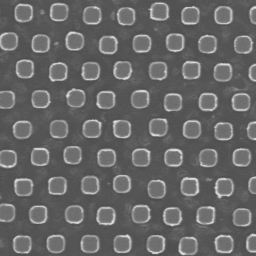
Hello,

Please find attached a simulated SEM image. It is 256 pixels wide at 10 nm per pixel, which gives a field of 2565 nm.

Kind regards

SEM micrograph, a regular array of raised bodies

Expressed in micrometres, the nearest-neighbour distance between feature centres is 0.316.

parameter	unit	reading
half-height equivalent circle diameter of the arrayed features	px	18.9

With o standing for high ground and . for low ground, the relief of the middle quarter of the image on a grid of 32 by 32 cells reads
o....oooo...ooooo.....ooo.....oo
o....oooo...ooooo.....oooo....oo
o...ooooo...ooooo.....oooo....oo
o....ooo.....ooo......ooo.....oo
................................
................................
..o.............................
.oooo....ooo.....oooo.....ooo...
.oooo...ooooo....oooo....oooo...
.oooo...ooooo....oooo....oooo...
..oo....oooo.....oooo....oooo...
..........................ooo...
................................
................................
.....oooo...oooo.....ooooo....oo
o....oooo...ooooo....ooooo....oo
o....oooo...oooo.....ooooo....oo
o....oooo....ooo......ooo.....oo
................................
................................
................................
oooo......oo......ooo.....ooo...
oooo....ooooo....oooo....oooo...
oooo....ooooo....oooo....oooo...
oooo.....oooo....oooo....oooo...
..................ooo.....ooo...
................................
................................
.....ooo.....ooo..............o.
....ooooo...ooooo....oooo....ooo
....ooooo...ooooo....oooo....ooo
....ooooo....ooo.....oooo....ooo